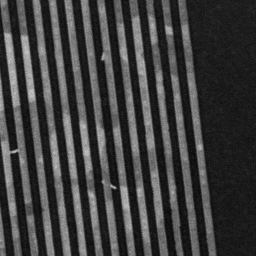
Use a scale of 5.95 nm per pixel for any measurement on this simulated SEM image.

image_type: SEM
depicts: parallel lines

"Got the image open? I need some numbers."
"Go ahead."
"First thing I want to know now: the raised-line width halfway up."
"37.6 nanometres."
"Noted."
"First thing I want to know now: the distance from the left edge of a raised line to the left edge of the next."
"95.4 nanometers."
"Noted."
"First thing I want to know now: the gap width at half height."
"53.8 nm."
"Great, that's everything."